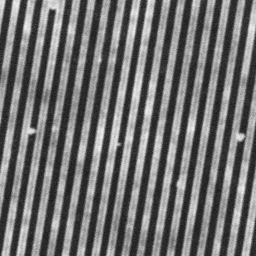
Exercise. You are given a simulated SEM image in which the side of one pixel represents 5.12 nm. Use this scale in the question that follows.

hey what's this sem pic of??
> parallel lines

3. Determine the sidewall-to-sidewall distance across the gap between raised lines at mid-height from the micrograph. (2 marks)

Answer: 46.8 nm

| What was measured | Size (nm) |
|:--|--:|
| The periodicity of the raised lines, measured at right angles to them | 75.9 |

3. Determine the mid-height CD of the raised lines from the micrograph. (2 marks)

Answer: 28.4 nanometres